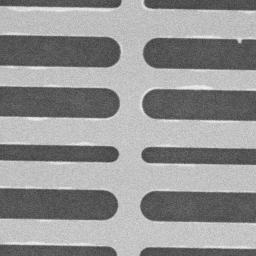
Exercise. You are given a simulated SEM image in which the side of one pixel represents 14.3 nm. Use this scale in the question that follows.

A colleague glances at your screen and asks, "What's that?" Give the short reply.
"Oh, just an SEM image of groups of lines, slits or small figures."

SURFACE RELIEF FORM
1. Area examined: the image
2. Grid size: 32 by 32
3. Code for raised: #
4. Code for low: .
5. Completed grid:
...............###..............
###############################.
################################
################################
...........#####################
...............###..............
...............###..............
...............###..............
####.#####...######.............
################################
################################
..............####..............
...............###..............
...............###..............
..............####..............
################################
################################
################################
..............####..............
...............###..............
###################.............
################################
################################
.....###########################
..............####..............
...............###..............
...............###..............
#####.##.....######.............
################################
################################
.......#########################
..............####..............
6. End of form